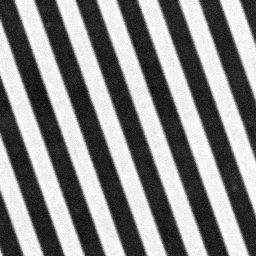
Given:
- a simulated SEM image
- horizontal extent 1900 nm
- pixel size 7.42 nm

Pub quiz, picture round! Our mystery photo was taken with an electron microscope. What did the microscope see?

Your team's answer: parallel lines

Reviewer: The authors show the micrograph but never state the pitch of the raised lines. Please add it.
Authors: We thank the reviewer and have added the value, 287 nanometers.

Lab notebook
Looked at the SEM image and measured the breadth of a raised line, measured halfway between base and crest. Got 15.7 px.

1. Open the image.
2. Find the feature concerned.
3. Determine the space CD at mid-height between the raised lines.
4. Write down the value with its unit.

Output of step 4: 174 nanometers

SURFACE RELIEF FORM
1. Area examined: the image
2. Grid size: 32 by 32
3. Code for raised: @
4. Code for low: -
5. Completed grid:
--@@---@@----@----@@---@@---@@--
---@@---@@---@@---@@---@@---@@--
---@@---@@---@@---@@----@----@@-
---@@---@@----@@---@@---@@---@@-
----@@---@@---@@---@@---@@---@@-
@---@@---@@---@@---@@----@@---@@
@---@@----@----@@---@@---@@---@@
@@---@@---@@---@@---@@---@@---@@
@@---@@---@@---@@---@@----@@---@
@@---@@----@@---@@---@@---@@---@
-@@---@@---@@---@@---@@---@@---@
-@@---@@---@@---@@----@----@@---
-@@---@@@---@@---@@---@@---@@---
--@@---@@---@@---@@---@@---@@---
--@@---@@---@@----@@---@@---@@--
--@@----@----@@---@@---@@---@@--
---@@---@@---@@---@@---@@----@--
---@@---@@---@@----@@---@@---@@-
----@----@@---@@---@@---@@---@@-
@---@@---@@---@@---@@---@@----@@
@---@@---@@----@----@@---@@---@@
@----@@---@@---@@---@@---@@---@@
@@---@@---@@---@@---@@---@@----@
@@---@@---@@----@@---@@---@@---@
-@----@@---@@---@@---@@---@@---@
-@@---@@---@@---@@----@----@----
-@@---@@---@@@---@@---@@---@@---
--@@---@@---@@---@@---@@---@@---
--@@---@@---@@---@@----@@---@@--
--@@---@@----@@---@@---@@---@@--
---@@---@@---@@---@@---@@---@@--
---@@---@@---@@---@@----@@---@@-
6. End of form